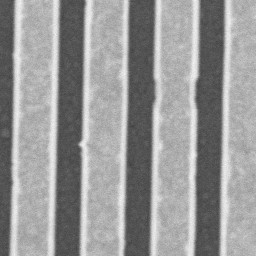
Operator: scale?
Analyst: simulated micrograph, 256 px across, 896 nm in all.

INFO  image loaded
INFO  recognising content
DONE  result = one or a few lines or trenches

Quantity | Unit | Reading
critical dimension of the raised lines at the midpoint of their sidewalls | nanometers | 134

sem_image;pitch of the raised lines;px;70.1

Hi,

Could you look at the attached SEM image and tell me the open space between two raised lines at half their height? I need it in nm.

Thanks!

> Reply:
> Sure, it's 110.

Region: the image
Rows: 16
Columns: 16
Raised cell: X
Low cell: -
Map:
-XX---XX--XX--XX
-XX--XXX--XX--XX
-XX--XXX--XX--XX
-XX--XXX--XX--XX
-XX--XXX--XX--XX
-XX--XXX--XX--XX
-XX--XXX--XX--XX
-XX--XXX--XX--XX
-XX--XXX--XX--XX
-XX--XXX--XX--XX
-XX--XXX--XX--XX
-XX--XXX--XX--XX
-XX--XXX--XX--XX
-XX--XXX--XX--XX
-XX--XXX--XX--XX
-XX--XXX--XX--XX